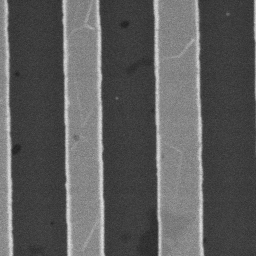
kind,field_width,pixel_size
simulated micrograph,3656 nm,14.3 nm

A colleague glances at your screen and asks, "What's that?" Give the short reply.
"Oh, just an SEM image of lines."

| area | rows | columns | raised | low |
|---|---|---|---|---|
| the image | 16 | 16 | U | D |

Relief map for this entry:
DDDDUUDDDDUUDDDD
DDDDUUDDDDUUDDDD
DDDDUUDDDDUUDDDD
DDDDUUDDDDUUDDDD
UDDDUUDDDDUUDDDD
UDDDUUDDDDUUDDDD
UDDDUUDDDDUUDDDD
UDDDUUDDDDUUUDDD
UDDDUUDDDDUUUDDD
UDDDUUDDDDUUUDDD
UDDDUUDDDDUUUDDD
UDDDUUDDDDUUUDDD
UDDDUUDDDDUUUDDD
UDDDUUDDDDUUUDDD
UDDDUUDDDDUUUDDD
UDDDUUDDDDUUUDDD